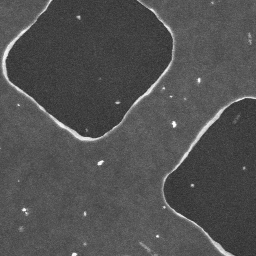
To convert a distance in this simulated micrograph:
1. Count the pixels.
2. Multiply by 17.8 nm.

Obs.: holes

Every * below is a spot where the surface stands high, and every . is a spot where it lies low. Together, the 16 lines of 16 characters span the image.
***......*******
**........******
*..........*****
...........*****
..........******
*........*******
**......******..
****....*****...
*****.******....
************....
***********.....
**********......
**********......
***********.....
*************...
**************..